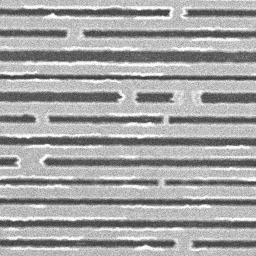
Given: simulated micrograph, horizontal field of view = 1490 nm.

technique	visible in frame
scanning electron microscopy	parallel lines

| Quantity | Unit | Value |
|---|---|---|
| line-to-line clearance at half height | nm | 42.9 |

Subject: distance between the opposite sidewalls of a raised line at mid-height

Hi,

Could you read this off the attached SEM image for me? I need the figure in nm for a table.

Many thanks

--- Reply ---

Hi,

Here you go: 74.9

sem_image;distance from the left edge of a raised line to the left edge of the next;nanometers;123